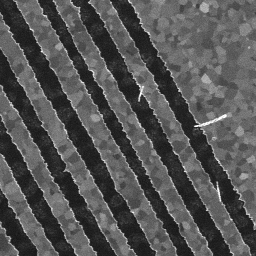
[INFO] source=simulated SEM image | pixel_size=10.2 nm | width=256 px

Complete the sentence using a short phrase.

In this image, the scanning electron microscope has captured parallel lines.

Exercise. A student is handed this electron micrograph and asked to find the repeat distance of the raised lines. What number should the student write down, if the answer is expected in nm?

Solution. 343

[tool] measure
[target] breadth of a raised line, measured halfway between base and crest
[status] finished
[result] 177 nanometers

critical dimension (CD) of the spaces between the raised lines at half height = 16.3 pixels